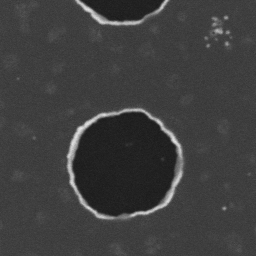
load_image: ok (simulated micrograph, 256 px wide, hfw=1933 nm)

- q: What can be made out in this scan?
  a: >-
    holes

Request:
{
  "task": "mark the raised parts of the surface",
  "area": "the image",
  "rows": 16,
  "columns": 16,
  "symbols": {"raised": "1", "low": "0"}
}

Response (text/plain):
1111110000111111
1111111111111111
1111111111111111
1111111111111111
1111111111111111
1111111111111111
1111111111111111
1111110000111111
1111100000111111
1111100000011111
1111100000011111
1111100000011111
1111100000111111
1111111011111111
1111111111111111
1111111111111111